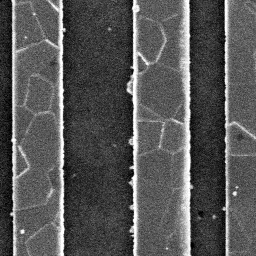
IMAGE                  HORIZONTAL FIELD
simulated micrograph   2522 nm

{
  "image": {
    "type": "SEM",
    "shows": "lines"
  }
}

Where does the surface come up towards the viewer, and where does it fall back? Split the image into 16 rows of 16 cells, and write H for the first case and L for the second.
LHHHLLLLHHHHLLHH
LHHHLLLLHHHHLLHH
LHHHLLLLHHHHLLHH
LHHHLLLLHHHHLLHH
LHHHLLLLHHHHLLHH
LHHHLLLLHHHHLLHH
LHHHLLLLHHHHLLHH
LHHHLLLLHHHHLLHH
LHHHLLLLHHHHLLHH
LHHHLLLLHHHHLLHH
LHHHLLLLHHHHLLHH
LHHHLLLLHHHHLLHH
LHHHLLLLHHHHLLHH
LHHHLLLLHHHHLLHH
LHHHLLLLHHHHLLHH
LHHHLLLLHHHHLLHH